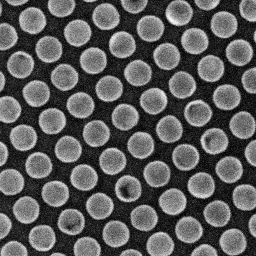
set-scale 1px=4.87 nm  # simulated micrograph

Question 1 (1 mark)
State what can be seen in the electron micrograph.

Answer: a regular array of raised bodies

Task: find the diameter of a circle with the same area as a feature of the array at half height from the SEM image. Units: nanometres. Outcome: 126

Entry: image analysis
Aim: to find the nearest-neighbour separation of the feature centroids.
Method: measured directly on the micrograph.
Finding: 32.1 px